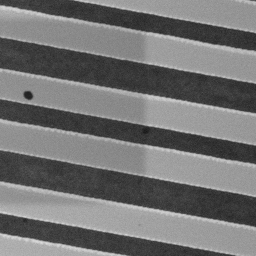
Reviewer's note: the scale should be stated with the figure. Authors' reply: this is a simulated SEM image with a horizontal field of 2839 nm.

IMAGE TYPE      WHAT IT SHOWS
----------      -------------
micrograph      lines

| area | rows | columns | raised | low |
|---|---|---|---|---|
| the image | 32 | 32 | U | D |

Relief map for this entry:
DDDDDDDDDDDDUUUUUUUUUUUUUUUUUUUU
UUUUUDDDDDDDDDDDDDUUUUUUUUUUUUUU
UUUUUUUUUUDDDDDDDDDDDDDUUUUUUUUU
UUUUUUUUUUUUUUUUDDDDDDDDDDDDDUUU
UUUUUUUUUUUUUUUUUUUUUDDDDDDDDDDD
DDDDDUUUUUUUUUUUUUUUUUUUUUDDDDDD
DDDDDDDDDDUUUUUUUUUUUUUUUUUUUUUU
DDDDDDDDDDDDDDDDUUUUUUUUUUUUUUUU
DDDDDDDDDDDDDDDDDDDDDDUUUUUUUUUU
UUUUUDDDDDDDDDDDDDDDDDDDDDDUUUUU
UUUUUUUUUUDDDDDDDDDDDDDDDDDDDDDD
UUUUUUUUUUUUUUUUDDDDDDDDDDDDDDDD
DUUUUUUUUUUUUUUUUUUUUUDDDDDDDDDD
DDDDDDDUUUUUUUUUUUUUUUUUUUUUDDDD
DDDDDDDDDDDDUUUUUUUUUUUUUUUUUUUU
UUUDDDDDDDDDDDDDDUUUUUUUUUUUUUUU
UUUUUUUUUDDDDDDDDDDDDDDUUUUUUUUU
UUUUUUUUUUUUUUDDDDDDDDDDDDDDUUUU
UUUUUUUUUUUUUUUUUUUUDDDDDDDDDDDD
DDDDUUUUUUUUUUUUUUUUUUUUUUDDDDDD
DDDDDDDDDDUUUUUUUUUUUUUUUUUUUUUD
DDDDDDDDDDDDDDDUUUUUUUUUUUUUUUUU
DDDDDDDDDDDDDDDDDDDDUUUUUUUUUUUU
UUUUDDDDDDDDDDDDDDDDDDDDDDUUUUUU
UUUUUUUUUUDDDDDDDDDDDDDDDDDDDDDU
UUUUUUUUUUUUUUUDDDDDDDDDDDDDDDDD
UUUUUUUUUUUUUUUUUUUUUDDDDDDDDDDD
DDDDDUUUUUUUUUUUUUUUUUUUUUUDDDDD
DDDDDDDDDDDUUUUUUUUUUUUUUUUUUUUU
UDDDDDDDDDDDDDDDUUUUUUUUUUUUUUUU
UUUUUUUUDDDDDDDDDDDDDDUUUUUUUUUU
UUUUUUUUUUUUUDDDDDDDDDDDDDDUUUUU